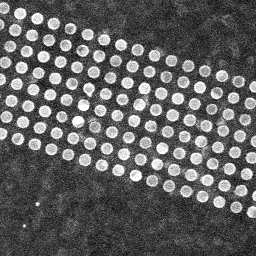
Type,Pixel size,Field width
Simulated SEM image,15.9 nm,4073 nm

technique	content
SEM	a regular array of raised bodies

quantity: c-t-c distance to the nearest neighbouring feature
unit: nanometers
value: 271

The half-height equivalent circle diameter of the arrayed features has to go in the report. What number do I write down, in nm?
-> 173